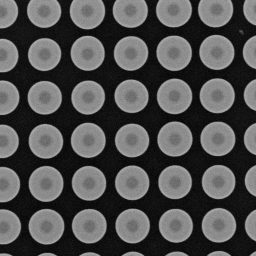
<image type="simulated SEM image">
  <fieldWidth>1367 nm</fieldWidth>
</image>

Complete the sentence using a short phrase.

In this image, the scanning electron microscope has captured an array of small figures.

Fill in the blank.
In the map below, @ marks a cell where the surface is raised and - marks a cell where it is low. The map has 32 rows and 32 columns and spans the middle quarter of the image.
---@@@@@@-----@@@@@@-----@@@@@@-
-----@@---------@@--------@@@---
--------------------------------
--------------------------------
----@@@@-------@@@@------@@@@@--
---@@@@@@----@@@@@@@----@@@@@@@-
--@@@@@@@@---@@@@@@@@---@@@@@@@@
--@@@@@@@@---@@@@@@@@--@@@@@@@@@
--@@@@@@@@---@@@@@@@@--@@@@@@@@@
--@@@@@@@@---@@@@@@@@--@@@@@@@@@
--@@@@@@@@---@@@@@@@----@@@@@@@-
---@@@@@@-----@@@@@------@@@@@--
-----@@-------------------------
--------------------------------
--------------------------------
----@@@@@------@@@@------@@@@@@-
---@@@@@@@----@@@@@@----@@@@@@@-
--@@@@@@@@---@@@@@@@@---@@@@@@@@
--@@@@@@@@---@@@@@@@@--@@@@@@@@@
--@@@@@@@@---@@@@@@@@--@@@@@@@@@
--@@@@@@@@---@@@@@@@@---@@@@@@@@
--@@@@@@@@----@@@@@@@---@@@@@@@-
---@@@@@@------@@@@@-----@@@@@--
--------------------------------
--------------------------------
----------------@@---------@----
---@@@@@@-----@@@@@@-----@@@@@@-
---@@@@@@@---@@@@@@@@---@@@@@@@-
--@@@@@@@@---@@@@@@@@---@@@@@@@@
--@@@@@@@@---@@@@@@@@---@@@@@@@@
--@@@@@@@@---@@@@@@@@---@@@@@@@@
--@@@@@@@@---@@@@@@@@---@@@@@@@@